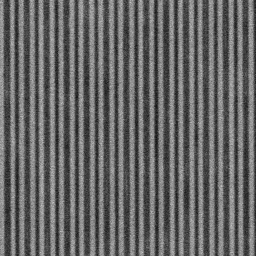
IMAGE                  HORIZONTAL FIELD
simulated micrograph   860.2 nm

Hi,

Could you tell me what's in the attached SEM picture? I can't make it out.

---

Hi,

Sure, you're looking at parallel lines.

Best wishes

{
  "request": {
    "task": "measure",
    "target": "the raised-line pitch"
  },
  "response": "33.4 nanometres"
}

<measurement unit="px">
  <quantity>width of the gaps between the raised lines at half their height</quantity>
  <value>6.13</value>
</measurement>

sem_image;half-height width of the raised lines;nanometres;14.7